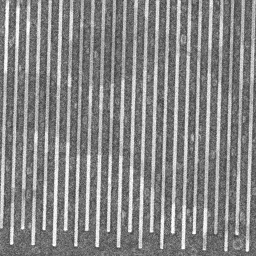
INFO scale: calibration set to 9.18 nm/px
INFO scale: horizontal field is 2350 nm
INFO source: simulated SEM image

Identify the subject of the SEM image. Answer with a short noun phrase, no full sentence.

parallel lines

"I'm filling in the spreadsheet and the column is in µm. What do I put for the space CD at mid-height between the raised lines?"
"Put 0.0757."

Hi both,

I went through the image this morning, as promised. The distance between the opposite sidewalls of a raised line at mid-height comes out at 0.0241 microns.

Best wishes